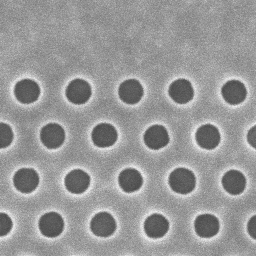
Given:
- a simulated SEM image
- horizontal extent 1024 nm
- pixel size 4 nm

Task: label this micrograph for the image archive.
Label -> a regular array of holes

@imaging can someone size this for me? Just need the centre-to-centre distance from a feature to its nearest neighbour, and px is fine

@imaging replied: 50.8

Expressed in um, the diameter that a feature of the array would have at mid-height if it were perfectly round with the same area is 0.105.